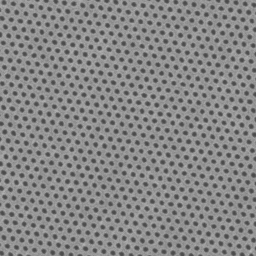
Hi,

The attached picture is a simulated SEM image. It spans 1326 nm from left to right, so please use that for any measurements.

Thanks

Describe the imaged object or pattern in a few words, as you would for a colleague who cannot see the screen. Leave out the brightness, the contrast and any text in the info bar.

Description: a regular array of holes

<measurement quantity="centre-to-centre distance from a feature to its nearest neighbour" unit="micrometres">0.0459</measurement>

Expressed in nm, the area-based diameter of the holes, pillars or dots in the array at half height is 26.1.